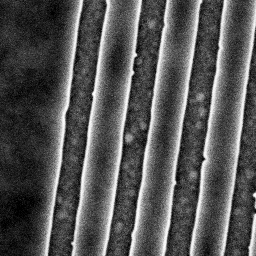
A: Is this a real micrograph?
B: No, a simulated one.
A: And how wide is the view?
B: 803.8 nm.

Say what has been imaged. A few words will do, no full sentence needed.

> parallel lines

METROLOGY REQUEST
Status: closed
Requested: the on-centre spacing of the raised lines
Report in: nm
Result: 184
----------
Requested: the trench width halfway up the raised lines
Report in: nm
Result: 78.8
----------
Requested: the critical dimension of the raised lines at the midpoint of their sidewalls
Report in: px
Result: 32.6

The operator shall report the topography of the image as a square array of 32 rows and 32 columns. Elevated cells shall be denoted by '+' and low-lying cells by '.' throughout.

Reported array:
++++++++++...+++++...++++...++++
++++++++++...++++....++++...++++
++++++++++...++++....++++...++++
++++++++++...++++....++++...++++
++++++++++...++++...++++....++++
+++++++++....++++...++++...+++++
+++++++++...+++++...++++...++++.
+++++++++...+++++...++++...++++.
+++++++++...+++++...++++...++++.
+++++++++...++++....++++...++++.
+++++++++...++++...+++++...++++.
+++++++++...++++...++++....++++.
+++++++++...++++...++++....++++.
++++++++...+++++...++++...++++..
++++++++...+++++...++++...++++..
++++++++...+++++...++++...++++..
++++++++...++++....++++...++++..
++++++++...++++....++++...++++..
++++++++...++++...++++....++++..
++++++++...++++...++++....++++..
++++++++...++++...++++...+++++..
+++++++...+++++...++++...++++...
+++++++...+++++...++++...++++...
+++++++...+++++...++++...++++...
+++++++...++++...+++++...++++...
+++++++...++++...++++....++++...
+++++++...++++...++++....++++...
++++++....++++...++++....++++...
++++++...+++++...++++...++++....
++++++...+++++...++++...++++....
++++++...++++....++++...++++...+
++++++...++++...+++++...++++...+